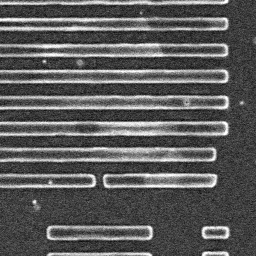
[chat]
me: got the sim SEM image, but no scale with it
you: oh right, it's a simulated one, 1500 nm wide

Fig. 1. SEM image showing wiring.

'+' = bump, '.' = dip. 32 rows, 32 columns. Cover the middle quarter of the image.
................................
................................
++++++++++++++++++++++++++++++++
++++++++++++++++++++++++++++++++
.......+++......................
................................
................................
................................
++++++++++++++++++++++++++++++++
++++++++++++++++++++++++++++++++
++++++++++++++++++++++++++++++++
................................
................................
................................
....++++..................++++..
++++++++++++++++++++++++++++++++
++++++++++++++++++++++++++++++++
++++++++++++++++++++++++++++++++
................................
................................
................................
++++++++++++++++++++++++++++++++
++++++++++++++++++++++++++++++++
++++++++++++++++++++++++++++++++
................................
................................
................................
................................
++++++++..++++++++++++++++++++++
++++++++..++++++++++++++++++++++
+++++++...++++++++++++++++++++++
................................